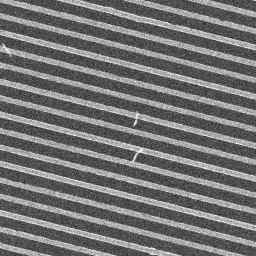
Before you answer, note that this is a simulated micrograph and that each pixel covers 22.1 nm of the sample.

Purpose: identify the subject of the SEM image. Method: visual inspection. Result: parallel lines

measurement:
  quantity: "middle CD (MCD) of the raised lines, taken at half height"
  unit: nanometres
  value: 102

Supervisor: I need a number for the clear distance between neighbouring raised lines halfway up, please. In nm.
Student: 246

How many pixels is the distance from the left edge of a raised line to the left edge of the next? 15.9